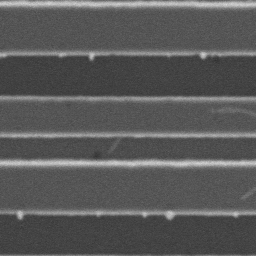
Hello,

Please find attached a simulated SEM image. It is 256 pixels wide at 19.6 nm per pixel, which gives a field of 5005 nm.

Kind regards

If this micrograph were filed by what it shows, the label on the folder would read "lines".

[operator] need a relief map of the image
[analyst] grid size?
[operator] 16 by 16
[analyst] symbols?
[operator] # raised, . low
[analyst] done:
################
################
################
................
................
................
################
################
################
################
################
################
################
..........#.....
................
................